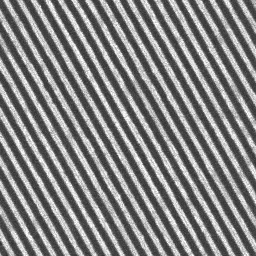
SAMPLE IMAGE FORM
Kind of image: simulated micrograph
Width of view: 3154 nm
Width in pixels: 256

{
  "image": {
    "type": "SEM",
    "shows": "parallel lines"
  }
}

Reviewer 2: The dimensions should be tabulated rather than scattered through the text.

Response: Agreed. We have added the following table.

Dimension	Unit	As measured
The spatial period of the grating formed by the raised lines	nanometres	148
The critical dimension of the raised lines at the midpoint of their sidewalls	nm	57.6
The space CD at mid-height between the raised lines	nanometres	91.1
